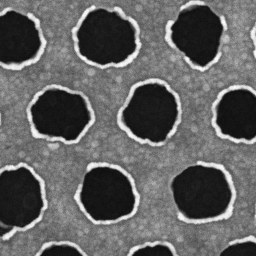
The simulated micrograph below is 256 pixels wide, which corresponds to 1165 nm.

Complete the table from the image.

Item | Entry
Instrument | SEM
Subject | holes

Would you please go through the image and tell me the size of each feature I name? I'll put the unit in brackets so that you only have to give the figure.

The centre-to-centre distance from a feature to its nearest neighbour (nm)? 412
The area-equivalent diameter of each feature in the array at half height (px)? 54.8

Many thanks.